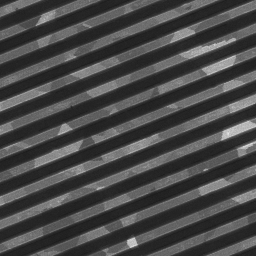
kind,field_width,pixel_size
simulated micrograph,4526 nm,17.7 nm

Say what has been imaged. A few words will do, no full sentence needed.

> parallel lines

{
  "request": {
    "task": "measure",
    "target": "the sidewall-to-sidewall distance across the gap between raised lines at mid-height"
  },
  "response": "0.197 micrometres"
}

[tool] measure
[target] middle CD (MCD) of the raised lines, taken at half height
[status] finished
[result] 182 nm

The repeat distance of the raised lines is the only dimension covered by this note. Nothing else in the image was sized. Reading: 388 nanometers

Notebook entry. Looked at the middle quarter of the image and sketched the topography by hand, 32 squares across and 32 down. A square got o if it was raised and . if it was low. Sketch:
......ooooooo........ooooooo....
....oooooo........ooooooo.......
.ooooooo........ooooooo........o
ooooo........ooooooo........oooo
ooo........ooooooo........oooooo
........ooooooo........ooooooo..
......ooooooo........oooooo.....
...ooooooo........ooooooo.......
.ooooooo........oooooo........oo
ooooo........ooooooo........oooo
ooo........oooooo........ooooooo
o.......ooooooo........oooooo...
......oooooo........ooooooo.....
...ooooooo........oooooo........
.oooooo........ooooooo........oo
ooooo........oooooo.........oooo
oo........ooooooo........ooooooo
........oooooo.........oooooo...
.....ooooooo........ooooooo.....
...oooooo.........oooooo........
ooooooo........ooooooo.......ooo
ooooo........oooooo........ooooo
oo........ooooooo.......oooooooo
........oooooo........ooooooo...
.....ooooooo.......oooooooo.....
...oooooo........ooooooo........
ooooooo........ooooooo........oo
oooo........ooooooo........ooooo
oo........ooooooo........oooooo.
.......ooooooo........ooooooo...
.....ooooooo........oooooo......
..ooooooo........ooooooo.......o